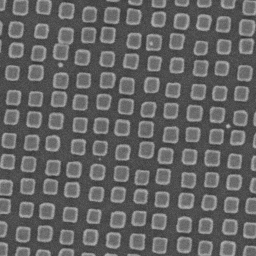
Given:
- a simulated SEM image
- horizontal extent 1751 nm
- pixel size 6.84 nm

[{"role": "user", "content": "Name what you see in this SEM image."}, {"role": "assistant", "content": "a regular array of raised bodies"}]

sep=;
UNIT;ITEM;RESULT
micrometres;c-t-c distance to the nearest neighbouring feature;0.142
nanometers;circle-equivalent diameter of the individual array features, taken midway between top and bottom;103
